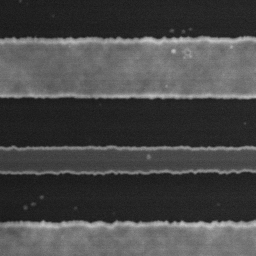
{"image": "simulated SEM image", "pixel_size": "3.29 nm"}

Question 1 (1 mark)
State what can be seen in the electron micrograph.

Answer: lines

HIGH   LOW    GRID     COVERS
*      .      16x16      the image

................
................
****************
****************
****************
****************
................
................
................
****************
****************
................
................
................
****************
****************